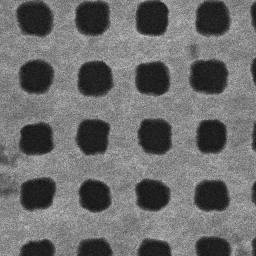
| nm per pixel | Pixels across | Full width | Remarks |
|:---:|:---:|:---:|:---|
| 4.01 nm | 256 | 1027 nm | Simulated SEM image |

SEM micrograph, a regular array of holes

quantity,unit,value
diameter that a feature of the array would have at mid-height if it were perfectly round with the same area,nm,134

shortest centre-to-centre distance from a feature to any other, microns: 0.229